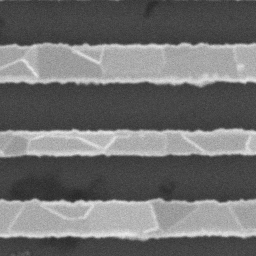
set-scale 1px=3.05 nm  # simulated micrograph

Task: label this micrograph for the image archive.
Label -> lines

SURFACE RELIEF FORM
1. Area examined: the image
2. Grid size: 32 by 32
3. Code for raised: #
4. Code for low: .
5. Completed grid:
................................
................................
................................
................................
................................
.....##................#.#......
################################
################################
################################
################################
................................
................................
................................
................................
................................
................................
.#.....#.#..#.##.##.###.#..####.
################################
################################
##..............................
................................
................................
................................
................................
................................
################################
################################
################################
################################
########.#####..########......#.
................................
................................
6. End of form